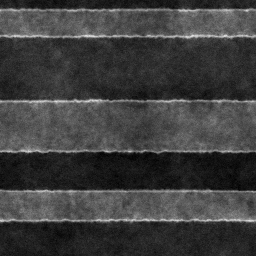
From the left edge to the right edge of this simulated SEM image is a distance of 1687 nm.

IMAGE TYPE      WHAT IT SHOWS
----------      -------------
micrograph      lines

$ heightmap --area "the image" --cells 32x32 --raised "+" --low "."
................................
++++++++++++++++++++++++++++++++
++++++++++++++++++++++++++++++++
++++++++++++++++++++++++++++++++
.++++++++++++++.++++++++..++++.+
................................
................................
................................
................................
................................
................................
................................
................................
++++++++++++++++++++++++++++++++
++++++++++++++++++++++++++++++++
++++++++++++++++++++++++++++++++
++++++++++++++++++++++++++++++++
++++++++++++++++++++++++++++++++
++++++++++++++++++++++++++++++++
................................
................................
................................
................................
................................
++++++++++++++++++++++++++++++++
++++++++++++++++++++++++++++++++
++++++++++++++++++++++++++++++++
++++++++++++++++++++++++++++++++
................................
................................
................................
................................